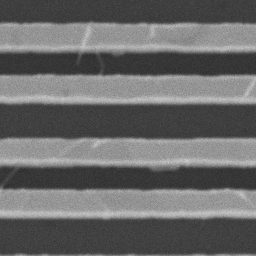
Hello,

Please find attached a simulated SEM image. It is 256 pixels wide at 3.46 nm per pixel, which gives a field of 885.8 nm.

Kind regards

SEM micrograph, lines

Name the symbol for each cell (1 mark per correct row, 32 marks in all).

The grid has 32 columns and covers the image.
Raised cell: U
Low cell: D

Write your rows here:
DDDDDDDDDDDDDDDDDDDDDDDDDDDDDDDD
DDDDDDDDDDDDDDDDDDDDDDDDDDDDDDDD
DDDDDDDDDDDDDDDDDDDDDDDDDDDDDDDD
UUUUUUUUUUUUUUUUUUUUUUUUUUUUUUUU
UUUUUUUUUUUUUUUUUUUUUUUUUUUUUUUU
UUUUUUUUUUUUUUUUUUUUUUUUUUUUUUUU
DDDDDDDDDDDDDDDDDDDDDDDDDDDDDDDD
DDDDDDDDDDDDDDDDDDDDDDDDDDDDDDDD
DDDDDDDDDDDDDDDDDDDDDDDDDDDDDDDD
DDDDUUUDDUUDUDUDDDDDDDDDDDDDDDDD
UUUUUUUUUUUUUUUUUUUUUUUUUUUUUUUU
UUUUUUUUUUUUUUUUUUUUUUUUUUUUUUUU
UUUUDUUUUUUUUUUUUUUUUUUUUUUUUUUU
DDDDDDDDDDDDDDDDDDDDDDDDDDDDDDDD
DDDDDDDDDDDDDDDDDDDDDDDDDDDDDDDD
DDDDDDDDDDDDDDDDDDDDDDDDDDDDDDDD
DDDDDDDDDDDDDDDDDDDDDDDDDDDDDDDD
UUUUUUUUDUUUUUUUUUDDDDDDUUUUUUUU
UUUUUUUUUUUUUUUUUUUUUUUUUUUUUUUU
UUUUUUUUUUUUUUUUUUUUUUUUUUUUUUUU
DDUDDDDDDDDDUUUUUUUUDDDDDDUUUUUU
DDDDDDDDDDDDDDDDDDDDDDDDDDDDDDDD
DDDDDDDDDDDDDDDDDDDDDDDDDDDDDDDD
DDDDDDDDDDDDDDDDDDDDDDDDDDDDDDDD
UUUUUUUUUUUUUUUUUUUUUUUUUUUUUUUU
UUUUUUUUUUUUUUUUUUUUUUUUUUUUUUUU
UUUUUUUUUUUUUUUUUUUUUUUUUUUUUUUU
DDDDDDDDDDDDDDDDDDDDDDDDDDDDDDDD
DDDDDDDDDDDDDDDDDDDDDDDDDDDDDDDD
DDDDDDDDDDDDDDDDDDDDDDDDDDDDDDDD
DDDDDDDDDDDDDDDDDDDDDDDDDDDDDDDD
DDDDDDDDDDDDDDDDDDDDDDDDDDDDDDDD